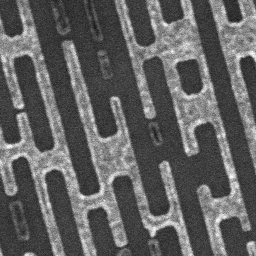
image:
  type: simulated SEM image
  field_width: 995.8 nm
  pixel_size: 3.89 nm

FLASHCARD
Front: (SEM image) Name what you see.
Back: parallel lines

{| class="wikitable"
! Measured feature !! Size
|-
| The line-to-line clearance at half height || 79.9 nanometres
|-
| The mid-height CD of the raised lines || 41.4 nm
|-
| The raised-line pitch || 121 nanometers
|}